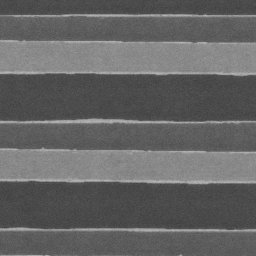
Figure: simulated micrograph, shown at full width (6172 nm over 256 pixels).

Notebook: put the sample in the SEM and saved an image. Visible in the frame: lines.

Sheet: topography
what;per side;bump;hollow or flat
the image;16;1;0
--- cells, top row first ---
0000000000000000
1111111111111111
1111111111111111
1111111111111111
1111111111111111
0000000000000000
0000000000000000
0000000000000000
1111111111111111
1111111111111111
1111111111111111
0000000000000000
0000000000000000
0000000000000000
1111111111111111
1111111111111111